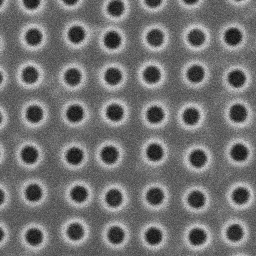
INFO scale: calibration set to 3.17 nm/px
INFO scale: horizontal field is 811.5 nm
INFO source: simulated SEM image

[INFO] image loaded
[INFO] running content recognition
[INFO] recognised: a regular array of holes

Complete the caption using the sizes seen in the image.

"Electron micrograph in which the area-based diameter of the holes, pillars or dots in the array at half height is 61.1 nm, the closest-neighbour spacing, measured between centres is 0.118 microns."